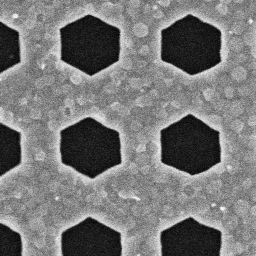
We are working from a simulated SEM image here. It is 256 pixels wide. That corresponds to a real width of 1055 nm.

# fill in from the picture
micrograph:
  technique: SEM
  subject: holes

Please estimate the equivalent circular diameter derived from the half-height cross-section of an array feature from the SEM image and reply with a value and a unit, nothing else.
245 nm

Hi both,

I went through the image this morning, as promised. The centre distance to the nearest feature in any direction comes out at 413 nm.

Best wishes